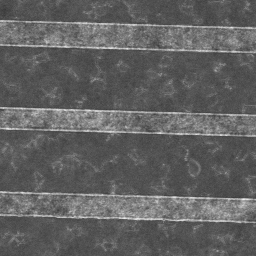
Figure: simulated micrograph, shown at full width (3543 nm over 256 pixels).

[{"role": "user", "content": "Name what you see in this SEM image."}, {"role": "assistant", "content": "one or a few lines or trenches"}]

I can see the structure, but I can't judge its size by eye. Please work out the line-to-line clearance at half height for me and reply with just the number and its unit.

874 nm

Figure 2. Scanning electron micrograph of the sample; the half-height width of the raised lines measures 315 nanometers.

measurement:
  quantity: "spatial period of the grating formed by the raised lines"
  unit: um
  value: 1.18